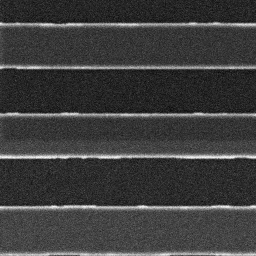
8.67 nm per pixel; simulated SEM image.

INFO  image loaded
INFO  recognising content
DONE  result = lines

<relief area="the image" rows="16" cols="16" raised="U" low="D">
DDDDDDDDDDDDDDDD
UUUUUUUUUUUUUUUU
UUUUUUUUUUUUUUUU
UUUUUUUUUUUUUUUU
DDDDDDDDDDDDDDDD
DDDDDDDDDDDDDDDD
DDDDDDDDDDDDDDDD
UUUUUUUUUUUUUUUU
UUUUUUUUUUUUUUUU
UUUUUUUUUUUUUUUU
DDDDDDDDDDDDDDDD
DDDDDDDDDDDDDDDD
DDDDDDDDDDDDDDDD
UUUUUUUUUUUUUUUU
UUUUUUUUUUUUUUUU
UUUUUUUUUUUUUUUU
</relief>